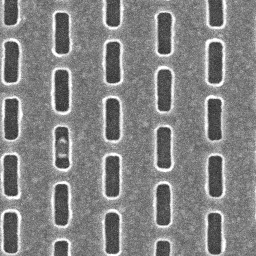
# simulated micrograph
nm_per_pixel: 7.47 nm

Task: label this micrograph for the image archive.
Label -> a regular array of holes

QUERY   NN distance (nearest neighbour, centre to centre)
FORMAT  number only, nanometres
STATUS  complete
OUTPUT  424